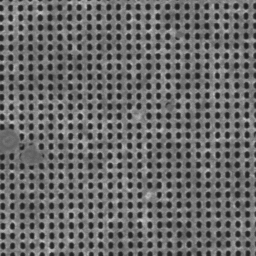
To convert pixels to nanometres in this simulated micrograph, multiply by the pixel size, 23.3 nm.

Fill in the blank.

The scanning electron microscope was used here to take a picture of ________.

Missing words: a regular array of holes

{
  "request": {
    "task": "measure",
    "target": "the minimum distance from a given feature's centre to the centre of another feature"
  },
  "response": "0.22 um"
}